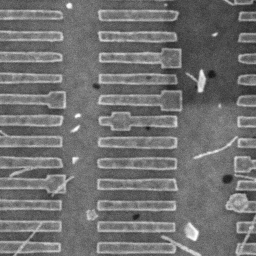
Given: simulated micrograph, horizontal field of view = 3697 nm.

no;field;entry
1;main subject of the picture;wiring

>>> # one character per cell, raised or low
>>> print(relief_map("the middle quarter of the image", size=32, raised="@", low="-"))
-------------------------@@@@---
--------------------------------
--------------------------------
---------@@@@@@@@@@@@@@@@@@@----
---------@@@@@@@@@@@@@@@@@@@----
--------------------------------
--------------------------------
------------------------@@@@@---
---------@@@@@@@@@@@@@@@@@@@@---
---------@@@@@@@@@@@@@@@@@@@@---
------------------------@@@@@---
-------------------------@@@@---
------------@@@@----------------
---------@@@@@@@@@@@@@@@@@@@----
---------@@@@@@@@@@@@@@@@@@@----
------------@@@@@-----@@@@@@----
--------------------------------
--------------------------------
----------@@@@@@@@@@@@@@@@@@----
---------@@@@@@@@@@@@@@@@@@@----
---------@@@@@@@@@@@@@@@@@@@----
--------------------------------
--------------------------------
--------------------------------
---------@@@@@@@@@@@@@@@@@@@----
---------@@@@@@@@@@@@@@@@@@@----
--------------------------------
--------------------------------
--------------------------------
@--------@@@@@@@@@@@@@@@@@@@----
---------@@@@@@@@@@@@@@@@@@@----
--------------------------------